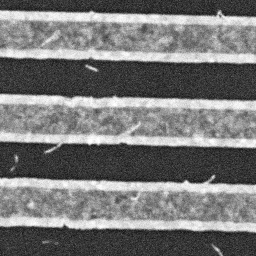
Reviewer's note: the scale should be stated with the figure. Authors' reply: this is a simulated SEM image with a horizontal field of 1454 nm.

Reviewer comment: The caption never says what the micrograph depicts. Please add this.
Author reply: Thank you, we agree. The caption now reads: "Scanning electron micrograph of one or a few lines or trenches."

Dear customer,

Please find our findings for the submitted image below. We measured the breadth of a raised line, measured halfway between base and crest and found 218 nanometers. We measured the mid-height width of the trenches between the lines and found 261 nm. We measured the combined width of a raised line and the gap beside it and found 478 nm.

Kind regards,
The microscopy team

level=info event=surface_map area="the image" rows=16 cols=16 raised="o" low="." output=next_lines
................
oooooooooooooooo
oooooooooooooooo
.........ooooooo
................
................
ooooooooooo.....
oooooooooooooooo
oooooooooooooooo
................
................
ooo.............
oooooooooooooooo
oooooooooooooooo
................
................